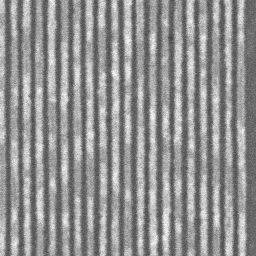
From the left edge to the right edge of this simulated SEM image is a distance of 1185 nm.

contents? parallel lines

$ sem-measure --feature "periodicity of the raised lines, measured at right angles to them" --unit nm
58.4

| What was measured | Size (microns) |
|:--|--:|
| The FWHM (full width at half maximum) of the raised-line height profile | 0.0232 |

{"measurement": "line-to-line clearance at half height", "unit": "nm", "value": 32.4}